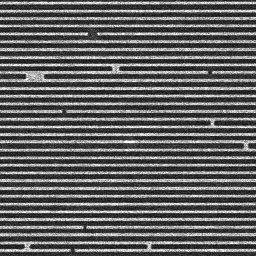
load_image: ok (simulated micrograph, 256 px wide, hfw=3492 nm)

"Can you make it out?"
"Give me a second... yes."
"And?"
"parallel lines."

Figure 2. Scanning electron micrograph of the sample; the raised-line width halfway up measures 2.87 pixels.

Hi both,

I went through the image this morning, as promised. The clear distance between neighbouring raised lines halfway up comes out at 63.1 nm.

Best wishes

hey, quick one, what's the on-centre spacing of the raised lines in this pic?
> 106 nanometres